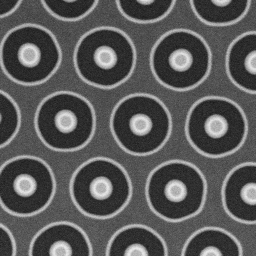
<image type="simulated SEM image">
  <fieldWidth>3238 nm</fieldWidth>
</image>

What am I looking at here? an array of small figures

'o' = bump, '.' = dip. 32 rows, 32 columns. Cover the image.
..oooo......ooo......ooo.......o
.ooooo.....oooo......oooo......o
ooooooooooooooooo..oooooo.....oo
oo...ooooooooooooooooooooooooooo
o.....ooooo.....ooooo....ooooo..
.......ooo......oooo......ooo...
...oo..oo...oo...oo...o...ooo...
...oo..oo...oo...oo..ooo..oo...o
o......ooo......ooo...o...oo...o
o.....oooo......oooo......ooo...
oooooooooooo...oooooo....ooooo..
oooooooooooooooooooooooooooooooo
.ooooo.....ooooo...oooooo...oooo
..ooo......oooo......ooo......oo
..ooo..oo...oo.......ooo......oo
..ooo..oo...oo..ooo..oo...oo...o
..ooo.......oo...o...oo...oo...o
.oooo......oooo......ooo......oo
ooooooo...ooooo.....ooooo.....oo
oooooooooooooooooooooooooooooooo
o.....ooooo...ooooooo..ooooooooo
......oooo.....oooo......oooo...
..oo...oo...o...ooo......ooo....
..oo...oo...oo..oo...oo...oo...o
......ooo...o...oo...oo...oo..oo
......oooo......ooo......ooo....
o....ooooo.....ooooo.....oooo...
oooooooooooooooooooooooooooooo..
oooooo....oooooo..oooooooooooooo
.oooo......ooo......oooo.....ooo
..oo...o...ooo......ooo.......oo
..oo..ooo..oo...oo...oo...o...oo